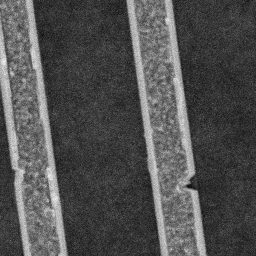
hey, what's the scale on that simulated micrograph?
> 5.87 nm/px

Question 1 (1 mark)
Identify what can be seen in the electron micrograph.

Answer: one or a few lines or trenches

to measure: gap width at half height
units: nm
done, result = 582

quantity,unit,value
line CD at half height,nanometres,225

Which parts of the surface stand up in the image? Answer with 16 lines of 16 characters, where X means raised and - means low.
XX------XXX-----
XX------XXX-----
XX------XXX-----
XX-------XX-----
XX-------XX-----
XXX------XX-----
XXX------XX-----
-XX------XXX----
-XX------XXX----
-XX------XXX----
-XX------XXX----
-XX-------XX----
-XXX------XX----
-XXX------XX----
--XX------XXX---
--XX------XXX---